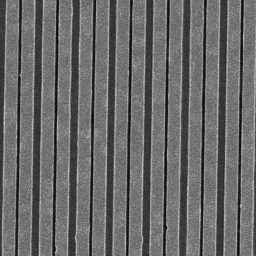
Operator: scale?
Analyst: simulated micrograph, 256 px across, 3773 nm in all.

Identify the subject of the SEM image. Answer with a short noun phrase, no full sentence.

parallel lines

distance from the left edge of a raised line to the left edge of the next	0.271	micrometres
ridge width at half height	12.9	px